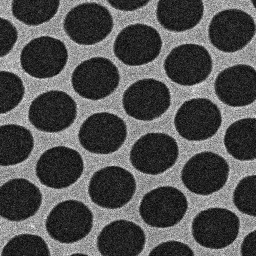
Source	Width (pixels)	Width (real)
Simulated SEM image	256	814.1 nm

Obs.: a regular array of holes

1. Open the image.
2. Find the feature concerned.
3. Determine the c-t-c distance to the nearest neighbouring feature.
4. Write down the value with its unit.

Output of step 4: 0.172 micrometres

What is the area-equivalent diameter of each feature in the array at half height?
141 nm